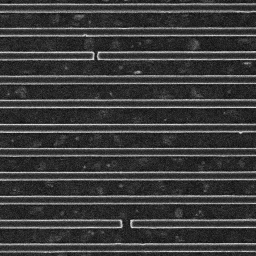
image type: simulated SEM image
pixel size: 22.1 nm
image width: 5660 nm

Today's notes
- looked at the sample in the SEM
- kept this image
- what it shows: parallel lines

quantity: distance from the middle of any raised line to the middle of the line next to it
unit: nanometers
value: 530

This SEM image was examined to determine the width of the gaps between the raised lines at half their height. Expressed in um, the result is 0.343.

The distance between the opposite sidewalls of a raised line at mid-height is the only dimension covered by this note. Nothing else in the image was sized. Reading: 171 nanometres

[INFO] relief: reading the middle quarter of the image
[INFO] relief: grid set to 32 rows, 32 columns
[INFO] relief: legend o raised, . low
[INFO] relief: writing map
................................
................................
................................
oooooooooooooooooooooooooooooooo
oooooooooooooooooooooooooooooooo
................................
................................
................................
................................
oooooooooooooooooooooooooooooooo
oooooooooooooooooooooooooooooooo
................................
................................
................................
................................
oooooooooooooooooooooooooooooooo
oooooooooooooooooooooooooooooooo
................................
................................
................................
................................
oooooooooooooooooooooooooooooooo
oooooooooooooooooooooooooooooooo
................................
................................
................................
................................
oooooooooooooooooooooooooooooooo
oooooooooooooooooooooooooooooooo
................................
................................
................................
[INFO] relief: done